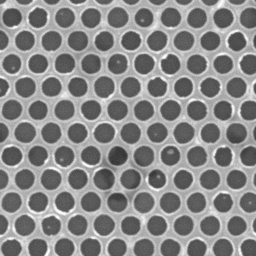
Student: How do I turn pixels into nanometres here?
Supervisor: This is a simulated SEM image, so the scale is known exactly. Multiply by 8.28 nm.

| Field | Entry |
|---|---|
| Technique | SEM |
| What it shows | a regular array of holes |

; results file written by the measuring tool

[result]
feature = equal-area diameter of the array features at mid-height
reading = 170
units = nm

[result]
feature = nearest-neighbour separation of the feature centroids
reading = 216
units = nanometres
